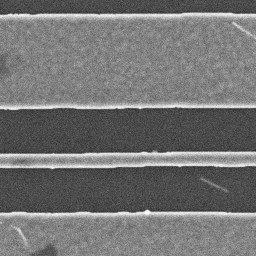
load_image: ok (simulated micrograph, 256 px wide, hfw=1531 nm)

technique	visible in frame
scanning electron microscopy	lines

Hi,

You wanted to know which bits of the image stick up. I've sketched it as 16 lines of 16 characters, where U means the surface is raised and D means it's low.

DDDDDDDDDDDDDDDD
UUUUUUUUUUUUUUUU
UUUUUUUUUUUUUUUU
UUUUUUUUUUUUUUUU
UUUUUUUUUUUUUUUU
UUUUUUUUUUUUUUUU
UUUUUUUUUUUUUUUU
DDDDDDDDDDDDDDDD
DDDDDDDDDDDDDDDD
DDDDDDDDDDDDDDDD
DDDUDDDDDDDDDDDD
DDDDDDDDDDDDDDDD
DDDDDDDDDDDDDDDD
UUUUUUUUUUUUUUUU
UUUUUUUUUUUUUUUU
UUUUUUUUUUUUUUUU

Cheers